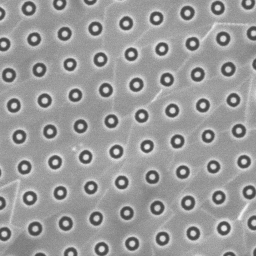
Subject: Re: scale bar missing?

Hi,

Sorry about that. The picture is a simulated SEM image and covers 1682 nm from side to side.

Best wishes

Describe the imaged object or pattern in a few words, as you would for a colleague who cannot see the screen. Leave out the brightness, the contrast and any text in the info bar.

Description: a regular array of ring-shaped grooves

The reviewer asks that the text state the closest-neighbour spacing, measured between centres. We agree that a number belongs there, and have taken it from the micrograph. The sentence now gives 203 nm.